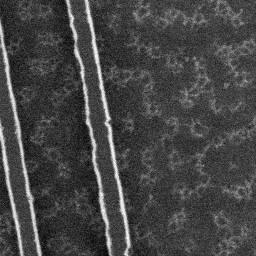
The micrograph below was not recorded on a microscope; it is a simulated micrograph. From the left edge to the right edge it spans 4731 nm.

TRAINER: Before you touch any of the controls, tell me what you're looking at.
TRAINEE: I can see one or a few lines or trenches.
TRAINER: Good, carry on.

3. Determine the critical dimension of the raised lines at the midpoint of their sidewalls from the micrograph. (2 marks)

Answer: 0.337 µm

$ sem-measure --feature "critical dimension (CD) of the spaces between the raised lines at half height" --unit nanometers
1310